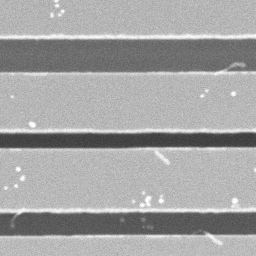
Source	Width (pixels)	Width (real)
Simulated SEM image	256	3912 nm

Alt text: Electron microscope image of lines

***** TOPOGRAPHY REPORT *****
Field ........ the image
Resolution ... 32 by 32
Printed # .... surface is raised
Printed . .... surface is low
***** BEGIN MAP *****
################################
################################
################################
################################
################################
................................
................................
................................
................................
################################
################################
################################
################################
################################
################################
################################
################################
................................
................................
################################
################################
################################
################################
################################
################################
################################
.##....#........................
................................
................................
..#..###.#######################
################################
################################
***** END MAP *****